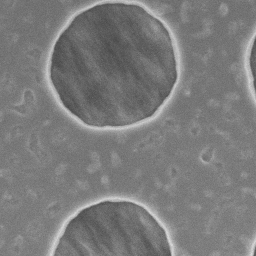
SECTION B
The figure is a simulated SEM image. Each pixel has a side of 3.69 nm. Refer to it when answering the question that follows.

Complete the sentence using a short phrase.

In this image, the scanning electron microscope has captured holes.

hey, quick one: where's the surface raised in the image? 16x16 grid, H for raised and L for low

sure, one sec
HHHHHHLLLHHHHHHH
HHHHLLLLLLHHHHHH
HHHHLLLLLLLHHHHH
HHHLLLLLLLLHHHHH
HHHLLLLLLLLHHHHH
HHHLLLLLLLLHHHHH
HHHHLLLLLLHHHHHH
HHHHHLLLLHHHHHHH
HHHHHHHHHHHHHHHH
HHHHHHHHHHHHHHHH
HHHHHHHHHHHHHHHH
HHHHHHHHHHHHHHHH
HHHHHHHHHHHHHHHH
HHHHHLLLLLHHHHHH
HHHHLLLLLLHHHHHH
HHHLLLLLLLLHHHHH